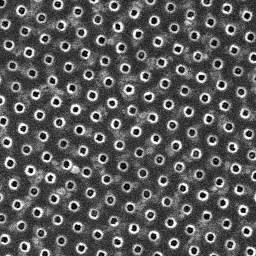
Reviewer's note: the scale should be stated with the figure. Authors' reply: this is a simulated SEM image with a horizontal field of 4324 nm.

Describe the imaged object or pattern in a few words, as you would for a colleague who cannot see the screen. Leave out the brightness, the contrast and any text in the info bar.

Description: a regular array of holes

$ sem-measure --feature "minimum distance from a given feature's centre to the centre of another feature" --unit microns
0.353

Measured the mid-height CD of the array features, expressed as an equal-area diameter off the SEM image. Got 0.123 microns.